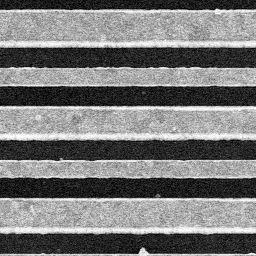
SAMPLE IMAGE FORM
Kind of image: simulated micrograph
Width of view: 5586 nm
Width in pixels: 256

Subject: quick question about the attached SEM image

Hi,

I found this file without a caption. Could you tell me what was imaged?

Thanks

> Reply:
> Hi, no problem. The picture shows lines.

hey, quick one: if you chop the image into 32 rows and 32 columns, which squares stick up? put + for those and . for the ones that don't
................................
++++++++++++++++++++++++++++++++
++++++++++++++++++++++++++++++++
++++++++++++++++++++++++++++++++
++++++++++++++++++++++++++++++++
++++++++++++++++++++++++++++++++
................................
................................
.+++++....+.+++++.+++.+++.+...+.
++++++++++++++++++++++++++++++++
++++++++++++++++++++++++++++++++
................................
................................
++++++++++++++++++++++++++++++++
++++++++++++++++++++++++++++++++
++++++++++++++++++++++++++++++++
++++++++++++++++++++++++++++++++
................................
................................
................................
++++++++++++++++++++++++++++++++
++++++++++++++++++++++++++++++++
................................
................................
................................
++++++++++++++++++++++++++++++++
++++++++++++++++++++++++++++++++
++++++++++++++++++++++++++++++++
++++++++++++++++++++++++++++++++
................................
................................
.................+..............